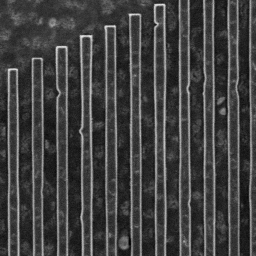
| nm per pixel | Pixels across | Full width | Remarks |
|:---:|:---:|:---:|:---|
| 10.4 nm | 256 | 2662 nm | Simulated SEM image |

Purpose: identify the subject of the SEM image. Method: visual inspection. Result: parallel lines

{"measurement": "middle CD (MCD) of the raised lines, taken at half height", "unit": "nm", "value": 100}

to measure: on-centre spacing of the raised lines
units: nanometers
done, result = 255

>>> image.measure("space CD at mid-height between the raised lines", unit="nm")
150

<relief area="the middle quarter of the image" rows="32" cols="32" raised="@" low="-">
@---@@@----@@----@@----@@----@@-
@---@@@----@@----@@----@@----@@-
@---@@@----@@----@@----@@----@@-
@----@@----@@----@@----@@----@@-
@----@@----@@----@@----@@----@@-
@----@@----@@----@@----@@----@@-
@----@@----@@----@@----@@----@@-
@----@@----@@----@@----@@----@@-
@----@@----@@----@@----@@----@@-
@----@@----@@----@@----@@----@@-
@----@@----@@----@@----@@----@@-
@----@@----@@----@@----@@----@@-
@----@@----@@----@@----@@----@@-
@----@@----@@----@@----@@----@@-
@----@@----@@----@@----@@----@@-
@---@@@----@@----@@----@@----@@-
@---@@@----@@----@@----@@----@@-
@---@@@----@@----@@----@@----@@-
@----@@----@@----@@----@@----@@-
@----@@----@@----@@----@@----@@-
@----@@----@@----@@----@@----@@-
@----@@----@@----@@----@@----@@-
@---@@@----@@----@@----@@----@@-
@---@@@----@@----@@----@@----@@-
@---@@@---@@@----@@----@@----@@-
@---@@@---@@@----@@----@@----@@-
@---@@@---@@@----@@----@@----@@-
@---@@@---@@@----@@----@@----@@-
@----@@---@@@----@@----@@----@@-
@----@@---@@@----@@----@@----@@-
@----@@----@@----@@----@@----@@-
@----@@----@@----@@----@@----@@-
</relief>